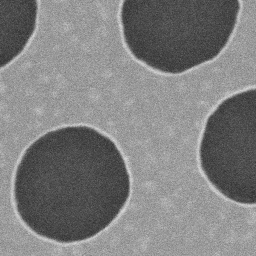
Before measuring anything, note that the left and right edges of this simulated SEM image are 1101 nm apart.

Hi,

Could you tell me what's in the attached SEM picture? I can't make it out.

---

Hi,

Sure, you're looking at holes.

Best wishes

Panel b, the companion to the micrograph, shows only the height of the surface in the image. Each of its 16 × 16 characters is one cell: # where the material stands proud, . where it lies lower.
..######.......#
..######.......#
..######......##
.#######......##
##########.#####
################
##############..
#############...
###....######...
##.....#####....
#.......#####...
#.......#####...
#.......######..
#......#########
##....##########
################